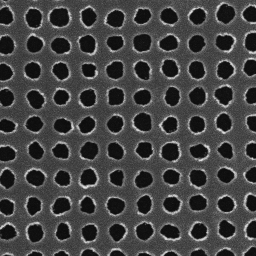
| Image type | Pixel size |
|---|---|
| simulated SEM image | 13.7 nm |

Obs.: a regular array of holes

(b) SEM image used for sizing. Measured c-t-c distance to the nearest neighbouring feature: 0.358 microns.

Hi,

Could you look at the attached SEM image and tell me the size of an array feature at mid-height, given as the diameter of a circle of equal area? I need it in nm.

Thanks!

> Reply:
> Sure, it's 228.